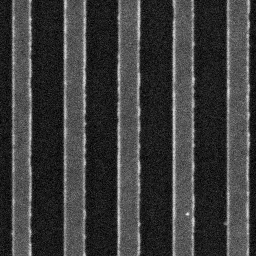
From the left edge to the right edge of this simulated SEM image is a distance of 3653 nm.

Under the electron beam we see lines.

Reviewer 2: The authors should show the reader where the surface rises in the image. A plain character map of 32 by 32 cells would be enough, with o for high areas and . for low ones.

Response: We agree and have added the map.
..oo....ooo....oo.....oo....ooo.
..oo....ooo....oo.....oo....ooo.
..oo....ooo....oo.....oo....ooo.
..oo....ooo....oo.....oo....ooo.
..oo....ooo....oo.....oo....ooo.
..oo....ooo....oo.....oo....ooo.
..oo....ooo....oo.....oo....ooo.
..oo....ooo....oo.....oo....ooo.
..oo....ooo....oo.....oo....ooo.
..oo....ooo....oo.....oo....ooo.
..oo....ooo....oo.....oo....ooo.
..oo....ooo....oo.....oo....ooo.
..oo....ooo....oo.....oo....ooo.
..oo....ooo....oo.....oo....ooo.
..oo....ooo....oo.....oo....ooo.
..oo....ooo....oo.....oo....ooo.
..oo....ooo....oo.....oo....ooo.
..oo....ooo....oo.....oo....ooo.
..oo....ooo....oo.....oo....ooo.
..oo....ooo....oo.....oo....ooo.
..oo....ooo....oo.....oo....ooo.
..oo....ooo....oo.....oo....ooo.
..oo....ooo....oo.....oo....ooo.
..oo....ooo....oo.....oo....ooo.
..oo....ooo....oo.....oo....ooo.
..oo....ooo....oo.....oo....ooo.
..oo....ooo....oo.....oo....ooo.
..oo....ooo....oo.....oo....ooo.
..oo....ooo....oo.....oo....ooo.
..oo....ooo....oo.....oo....ooo.
..oo....ooo....oo.....oo....ooo.
..oo....ooo....oo.....oo....ooo.